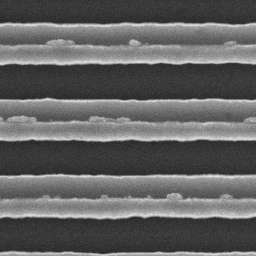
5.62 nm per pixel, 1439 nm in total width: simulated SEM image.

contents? lines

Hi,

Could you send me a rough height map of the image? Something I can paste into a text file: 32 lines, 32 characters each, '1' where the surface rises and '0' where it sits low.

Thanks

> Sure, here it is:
00000000000000000000000000000000
00000000000000000000000000000000
00000000000000000000000000000000
11111111111111111111111111111111
11111111111111111111111111111111
11111111111111111111111111111111
11111111111111111111111111111111
11111111111111111111111111111111
00000000000000000000000000000000
00000000000000000000000000000000
00000000000000000000000000000000
00000000000000000000000000000000
10011110000011101000010111110000
11111111111111111111111111111111
11111111111111111111111111111111
11111111111111111111111111111111
11111111111111111111111111111111
01000000001111000010001000000100
00000000000000000000000000000000
00000000000000000000000000000000
00000000000000000000000000000000
00000000000000000000000000000000
11111111111111111111111111111111
11111111111111111111111111111111
11111111111111111111111111111111
11111111111111111111111111111111
11111111111111111111111111111111
00000000000000000000000000000000
00000000000000000000000000000000
00000000000000000000000000000000
00000000000000000000000000000000
00000000000000000000000000000000